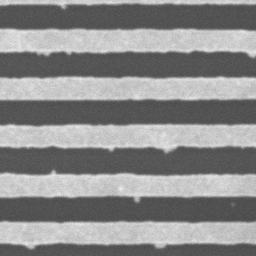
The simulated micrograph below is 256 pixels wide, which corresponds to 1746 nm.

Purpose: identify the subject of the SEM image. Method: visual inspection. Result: lines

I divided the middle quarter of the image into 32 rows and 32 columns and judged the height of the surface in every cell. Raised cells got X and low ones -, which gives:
--------------------------------
--------------------------------
--------------------------------
XXXXX-XX-------XXXX-------------
XXXXXXXXXXXXXXXXXXXXXXXXXXXXXXXX
XXXXXXXXXXXXXXXXXXXXXXXXXXXXXXXX
XXXXXXXXXXXXXXXXXXXXXXXXXXXXXXXX
XXXXXXXXXXXXXXXXXXXXXXXXXXXXXXXX
XXXXXXXXXXXXXXXXXXXXXXXXXXXXXXXX
--------------------------------
--------------------------------
--------------------------------
--------------------------------
--------------------------------
--------------------------------
XXXXXXX--X-XX---XXXXXXXXXXXXXXXX
XXXXXXXXXXXXXXXXXXXXXXXXXXXXXXXX
XXXXXXXXXXXXXXXXXXXXXXXXXXXXXXXX
XXXXXXXXXXXXXXXXXXXXXXXXXXXXXXXX
XXXXXXXXXXXXXXXXXXXXXXXXXXXXXXXX
XXXXXXXXXXXXXXXXXXXXXXXXXXXXX-XX
--------------------------------
--------------------------------
--------------------------------
--------------------------------
--------------------------------
--------------------------------
--------------------------------
XXXXXXXXXXXXXXXXXXXXXXXXXXXXXXXX
XXXXXXXXXXXXXXXXXXXXXXXXXXXXXXXX
XXXXXXXXXXXXXXXXXXXXXXXXXXXXXXXX
XXXXXXXXXXXXXXXXXXXXXXXXXXXXXXXX